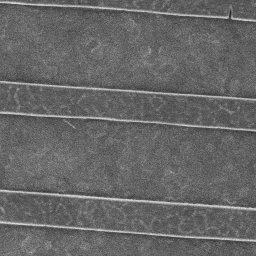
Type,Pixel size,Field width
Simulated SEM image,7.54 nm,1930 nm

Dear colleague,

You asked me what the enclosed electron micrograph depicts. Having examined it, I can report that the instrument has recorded one or a few lines or trenches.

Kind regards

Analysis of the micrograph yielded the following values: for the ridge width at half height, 0.236 µm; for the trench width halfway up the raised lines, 0.595 microns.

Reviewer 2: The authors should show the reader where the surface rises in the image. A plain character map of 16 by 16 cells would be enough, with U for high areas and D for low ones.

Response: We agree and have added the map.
DDDDDDDUUUUUUUUU
DDDDDDDDDDDDDDDD
DDDDDDDDDDDDDDDD
DDDDDDDDDDDDDDDD
DDDDDDDDDDDDDDDD
UUUUUUDDDDDDDDDD
UUUUUUUUUUUUUUUU
DDDDDDDUUUUUUUUU
DDDDDDDDDDDDDDDD
DDDDDDDDDDDDDDDD
DDDDDDDDDDDDDDDD
DDDDDDDDDDDDDDDD
UUUUUUUUDDDDDDDD
UUUUUUUUUUUUUUUU
DDDDDDDDUUUUUUUU
DDDDDDDDDDDDDDDD